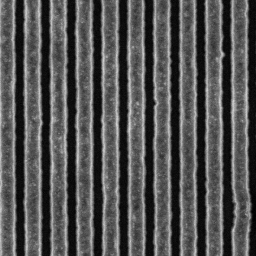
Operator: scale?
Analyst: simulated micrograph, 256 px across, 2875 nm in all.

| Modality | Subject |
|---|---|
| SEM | parallel lines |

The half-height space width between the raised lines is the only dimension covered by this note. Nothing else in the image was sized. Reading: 117 nanometres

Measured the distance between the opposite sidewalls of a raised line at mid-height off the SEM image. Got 170 nanometres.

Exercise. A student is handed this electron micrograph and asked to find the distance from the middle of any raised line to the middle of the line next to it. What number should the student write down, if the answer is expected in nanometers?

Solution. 291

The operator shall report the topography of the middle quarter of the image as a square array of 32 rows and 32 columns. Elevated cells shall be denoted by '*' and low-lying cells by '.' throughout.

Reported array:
...****...****..****...***...***
...****...***...****...***...***
...****...***...****...***...***
...****...***...****..****...***
...****...***...****..****...***
...****...***...****...***...***
*..****...****..****...***...***
...****...***...****...***...***
...****...***...****...***...***
...****...***...****...***...***
...****...***...****...***...***
...****...***...****...***...***
*..****...***...****...****..***
*..****...***...****...***...***
...****...***...****...***...***
...****...***...****...***...***
*..****...****..****...***...***
*..****...****..****...****..***
...****...***...****...****..***
...****...***...****...***...***
...****...***...****...****..***
...****...****..****...****..***
...****...****..****...****..***
...****...****..****...****..***
*..****...***...****...***...***
...****...****..****...***...***
...****...****..****...***...***
...****...****..****...***...***
...****...****..****...***...***
...****...***...****...***...***
*..****...***...****...***...***
...****...***...****...***...***